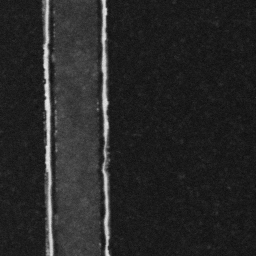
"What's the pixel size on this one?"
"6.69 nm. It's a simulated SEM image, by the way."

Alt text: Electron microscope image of one or a few lines or trenches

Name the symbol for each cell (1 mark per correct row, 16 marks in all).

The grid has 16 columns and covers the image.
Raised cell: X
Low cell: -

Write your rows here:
XXX---XXXXXXXXXX
XXX---XXXXXXXXXX
XXX---XXXXXXXXXX
XXX---XXXXXXXXXX
XXX----XXXXXXXXX
XXX----XXXXXXXXX
XXX----XXXXXXXXX
XXX----XXXXXXXXX
XXX----XXXXXXXXX
XXX----XXXXXXXXX
XXX----XXXXXXXXX
XXX----XXXXXXXXX
XXX----XXXXXXXXX
XXX----XXXXXXXXX
XXX----XXXXXXXXX
XXX----XXXXXXXXX